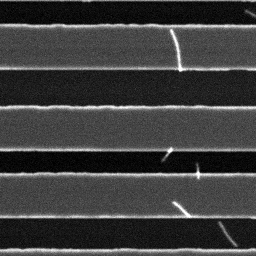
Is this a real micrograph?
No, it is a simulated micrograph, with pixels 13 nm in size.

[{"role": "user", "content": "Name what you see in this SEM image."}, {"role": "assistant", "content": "lines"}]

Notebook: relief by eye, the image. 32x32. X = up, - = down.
--------------------------------
--------------------------------
--------------------------------
XXXXXXXXXXXXXXXXXXXXXXXXXXXXXXXX
XXXXXXXXXXXXXXXXXXXXXXXXXXXXXXXX
XXXXXXXXXXXXXXXXXXXXXXXXXXXXXXXX
XXXXXXXXXXXXXXXXXXXXXXXXXXXXXXXX
XXXXXXXXXXXXXXXXXXXXXXXXXXXXXXXX
XXXXXXXXXXXXXXXXXXXXXXXXXXXXXXXX
--------------------------------
--------------------------------
--------------------------------
--------------------------------
XXXXXXXXXXXXXXXXXXXXXXXXXXXXXXXX
XXXXXXXXXXXXXXXXXXXXXXXXXXXXXXXX
XXXXXXXXXXXXXXXXXXXXXXXXXXXXXXXX
XXXXXXXXXXXXXXXXXXXXXXXXXXXXXXXX
XXXXXXXXXXXXXXXXXXXXXXXXXXXXXXXX
XXXXXXXXXXXXXXXXXXXXXXXXXXXXXXXX
--------------------------------
--------------------------------
--------------------------------
XXXXXXXXXXXXXXXXXXXXXXXXXXXXXXXX
XXXXXXXXXXXXXXXXXXXXXXXXXXXXXXXX
XXXXXXXXXXXXXXXXXXXXXXXXXXXXXXXX
XXXXXXXXXXXXXXXXXXXXXXXXXXXXXXXX
XXXXXXXXXXXXXXXXXXXXXXXXXXXXXXXX
--------------------------------
--------------------------------
--------------------------------
--------------------------------
XXXXXXXXXXXXXXXXXXXXXXXXXXXXXXXX